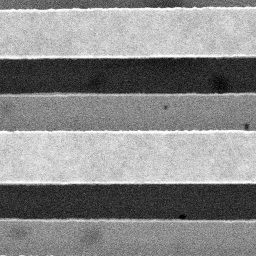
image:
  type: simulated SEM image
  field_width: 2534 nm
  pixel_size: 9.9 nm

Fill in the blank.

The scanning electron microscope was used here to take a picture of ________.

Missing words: lines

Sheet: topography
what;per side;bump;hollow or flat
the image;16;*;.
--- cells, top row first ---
****************
****************
****************
****************
................
................
****************
****************
****************
****************
****************
................
................
................
****************
****************